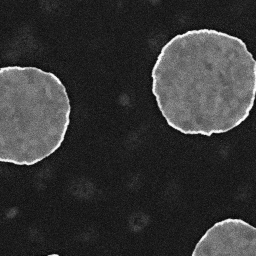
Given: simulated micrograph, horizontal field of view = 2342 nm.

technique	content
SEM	raised bodies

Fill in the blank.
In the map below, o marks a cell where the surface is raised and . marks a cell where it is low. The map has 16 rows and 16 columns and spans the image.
................
................
...........oooo.
..........oooooo
ooo.......oooooo
oooo......oooooo
oooo......oooooo
oooo......ooooo.
oooo............
ooo.............
................
................
................
................
.............ooo
............oooo